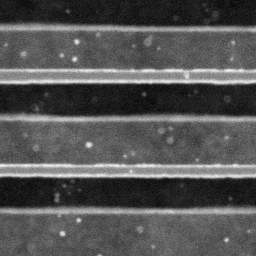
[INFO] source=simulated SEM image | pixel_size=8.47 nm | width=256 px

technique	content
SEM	lines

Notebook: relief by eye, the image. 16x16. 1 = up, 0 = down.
0000000000000000
0000000000000000
1111111111111111
1111111111111111
1111111111111111
0000000000000000
0000000000000000
1111111111110000
1111111111111111
1111111111111111
1111111111111111
0000000000000000
0000000000000000
1111111111111111
1111111111111111
1111111111111111